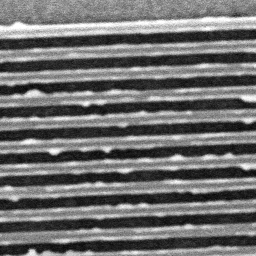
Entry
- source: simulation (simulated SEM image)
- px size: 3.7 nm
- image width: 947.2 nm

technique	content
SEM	parallel lines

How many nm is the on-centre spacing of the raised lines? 84.6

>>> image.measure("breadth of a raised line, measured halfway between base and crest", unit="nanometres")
43.8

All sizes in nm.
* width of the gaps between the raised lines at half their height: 40.6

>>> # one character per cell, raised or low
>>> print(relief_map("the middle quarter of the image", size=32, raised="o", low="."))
................................
....oooooooooooooooooooooooooooo
oooooooooooooooooooooooooooooooo
oooooooooooooooooo.ooooooo......
................................
................................
...........ooo............oooooo
oooooooooooooooooooooooooooooooo
oooooooooooooooooooooooooooooooo
ooooooooooooooo.................
.....o..........................
................................
..............oooooooooooooooooo
oooooooooooooooooooooooooooooooo
oooooooooooooooooooooooooooooooo
ooooooo..ooo.ooo................
................................
................................
............oooooooooooooooooooo
oooooooooooooooooooooooooooooooo
ooooooooooooooooooooooooo.......
o..ooooo.ooo....................
................................
....................o...oooooooo
..o..ooooooooooooooooooooooooooo
oooooooooooooooooooooooooooooooo
oooooooooooooooooo........oo....
..o.............................
................................
........o.............oooooooooo
oooooooooooooooooooooooooooooooo
oooooooooooooooooooooooooooooooo